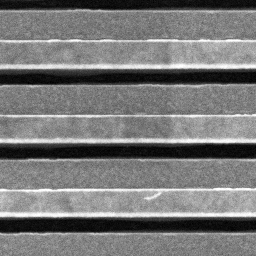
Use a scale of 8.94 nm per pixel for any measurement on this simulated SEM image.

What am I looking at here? lines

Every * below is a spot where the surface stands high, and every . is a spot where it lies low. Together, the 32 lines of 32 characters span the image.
................................
********************************
********************************
********************************
********************************
********************************
********************************
********************************
********************************
................................
................................
********************************
********************************
********************************
********************************
********************************
********************************
********************************
................................
................................
********************************
********************************
********************************
********************************
********************************
********************************
********************************
................................
................................
********************************
********************************
********************************